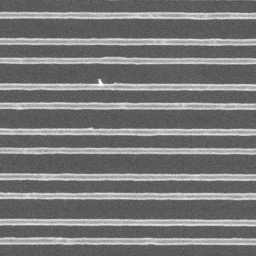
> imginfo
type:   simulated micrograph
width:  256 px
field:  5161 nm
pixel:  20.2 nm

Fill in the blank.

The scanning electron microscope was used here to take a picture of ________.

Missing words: parallel lines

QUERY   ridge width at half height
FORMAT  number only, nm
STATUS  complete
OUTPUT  108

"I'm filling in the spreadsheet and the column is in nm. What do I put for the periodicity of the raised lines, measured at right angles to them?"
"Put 455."